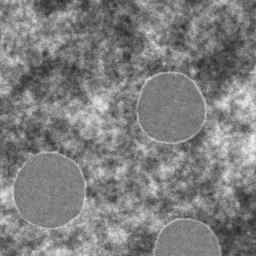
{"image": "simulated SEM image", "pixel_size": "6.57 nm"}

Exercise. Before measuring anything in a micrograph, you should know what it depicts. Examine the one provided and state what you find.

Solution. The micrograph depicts raised bodies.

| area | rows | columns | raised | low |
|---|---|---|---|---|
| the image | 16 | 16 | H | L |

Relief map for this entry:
LLLLLLLLLLLLLLLL
LLLLLLLLLLLLLLLL
LLLLLLLLLLLLLLLL
LLLLLLLLLLLLLLLL
LLLLLLLLLLLLLLLL
LLLLLLLLLHHHLLLL
LLLLLLLLLHHHHLLL
LLLLLLLLLHHHHLLL
LLLLLLLLLHHHLLLL
LLLLLLLLLLLLLLLL
LHHHHLLLLLLLLLLL
LHHHHLLLLLLLLLLL
LHHHHLLLLLLLLLLL
LHHHHLLLLLLLLLLL
LLLLLLLLLLHHHLLL
LLLLLLLLLLHHHHLL